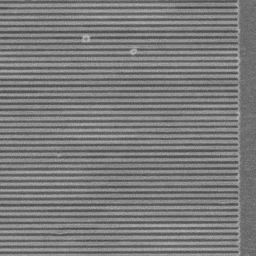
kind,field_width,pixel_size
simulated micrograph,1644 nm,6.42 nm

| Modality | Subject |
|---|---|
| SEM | parallel lines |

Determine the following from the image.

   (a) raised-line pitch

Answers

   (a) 0.0383 microns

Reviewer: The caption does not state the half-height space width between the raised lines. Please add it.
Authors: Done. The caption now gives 19.3 nm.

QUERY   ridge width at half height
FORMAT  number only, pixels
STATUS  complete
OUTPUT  2.88